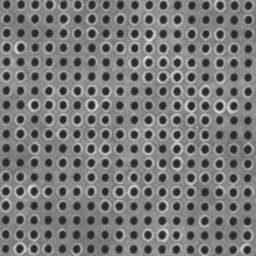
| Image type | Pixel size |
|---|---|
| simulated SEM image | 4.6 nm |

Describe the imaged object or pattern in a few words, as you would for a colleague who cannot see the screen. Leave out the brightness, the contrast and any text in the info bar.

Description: a regular array of holes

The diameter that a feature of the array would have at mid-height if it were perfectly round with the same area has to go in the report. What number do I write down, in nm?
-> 34.8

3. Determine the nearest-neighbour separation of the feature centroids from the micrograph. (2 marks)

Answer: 64.7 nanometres